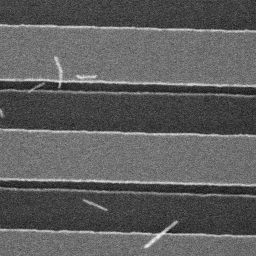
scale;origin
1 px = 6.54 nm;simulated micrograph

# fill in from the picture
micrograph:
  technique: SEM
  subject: lines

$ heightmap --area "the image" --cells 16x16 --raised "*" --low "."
................
................
****************
****************
****************
................
................
................
****************
****************
****************
.............***
................
................
******..........
****************